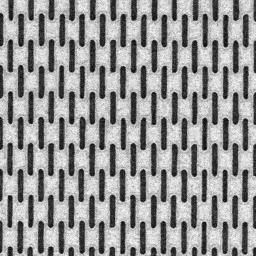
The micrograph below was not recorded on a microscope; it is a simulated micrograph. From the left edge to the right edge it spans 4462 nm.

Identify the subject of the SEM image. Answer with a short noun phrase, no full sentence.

a regular array of holes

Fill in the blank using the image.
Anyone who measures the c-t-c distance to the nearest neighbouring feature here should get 349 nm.